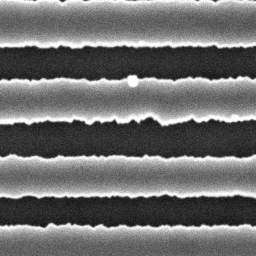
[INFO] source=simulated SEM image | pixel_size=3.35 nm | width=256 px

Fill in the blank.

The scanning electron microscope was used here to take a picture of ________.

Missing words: lines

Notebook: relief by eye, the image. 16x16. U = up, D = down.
UUUUUUUUUUUUUUUU
UUUUUUUUUUUUUUUU
UUUUUUUUUUUUUUUU
DDDDDDDDDDDDDDDD
DDDDDDDDDDDDDDDD
UUUUUUUUUUUUUUUU
UUUUUUUUUUUUUUUU
UUUUUUUUUDUUUDUU
DDDDDDDDDDDDDDDD
DDDDDDDDDDDDDDDD
UUUUUUUUUUUUUUUU
UUUUUUUUUUUUUUUU
DDDDDDDDDDDDDDDD
DDDDDDDDDDDDDDDD
UUUUUUUUUUUUUUUU
UUUUUUUUUUUUUUUU